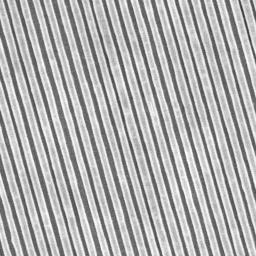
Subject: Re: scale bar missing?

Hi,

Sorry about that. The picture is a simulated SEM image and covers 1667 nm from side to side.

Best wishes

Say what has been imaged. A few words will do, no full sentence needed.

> parallel lines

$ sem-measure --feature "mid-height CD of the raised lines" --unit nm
37.6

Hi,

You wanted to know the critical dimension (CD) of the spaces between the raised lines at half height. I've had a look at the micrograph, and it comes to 37.6 nanometres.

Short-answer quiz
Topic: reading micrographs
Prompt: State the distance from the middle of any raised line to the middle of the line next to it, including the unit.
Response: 77.2 nm